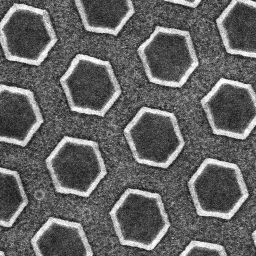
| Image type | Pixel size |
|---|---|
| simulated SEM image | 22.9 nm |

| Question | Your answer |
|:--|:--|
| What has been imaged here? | raised bodies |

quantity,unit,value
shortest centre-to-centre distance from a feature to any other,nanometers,1880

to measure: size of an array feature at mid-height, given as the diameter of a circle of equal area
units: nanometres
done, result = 1220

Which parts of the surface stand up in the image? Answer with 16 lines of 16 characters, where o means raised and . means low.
.o...ooo......oo
ooo..ooo......oo
ooo......ooo..oo
.oo......ooo....
....ooo..ooo....
....ooo......oo.
oo...oo......ooo
oo......ooo..ooo
oo......ooo.....
...ooo..ooo.....
...ooo.......oo.
o...oo......ooo.
oo......oo..ooo.
o......ooo......
...oo..ooo......
..oooo......oo..